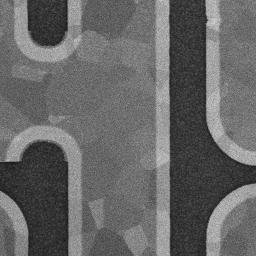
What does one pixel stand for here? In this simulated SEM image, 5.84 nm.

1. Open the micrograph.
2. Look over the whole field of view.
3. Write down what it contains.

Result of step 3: one or a few lines or trenches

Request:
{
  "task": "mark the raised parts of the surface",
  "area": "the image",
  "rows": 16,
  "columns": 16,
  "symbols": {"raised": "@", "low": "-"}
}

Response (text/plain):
@----@@@@@---@@@
@----@@@@@---@@@
@@--@@@@@@---@@@
@@@@@@@@@@---@@@
@@@@@@@@@@---@@@
@@@@@@@@@@---@@@
@@@@@@@@@@---@@@
@@@@@@@@@@---@@@
@@-@@@@@@@----@@
@---@@@@@@-----@
-----@@@@@------
-----@@@@@------
-----@@@@@----@@
@----@@@@@----@@
@----@@@@@---@@@
@----@@@@@---@@@